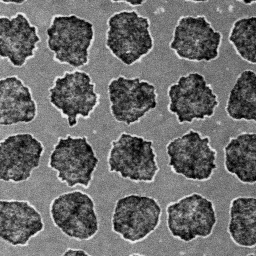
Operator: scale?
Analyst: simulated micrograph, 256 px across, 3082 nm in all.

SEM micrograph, a regular array of holes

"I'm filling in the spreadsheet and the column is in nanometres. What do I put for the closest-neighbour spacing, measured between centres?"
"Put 679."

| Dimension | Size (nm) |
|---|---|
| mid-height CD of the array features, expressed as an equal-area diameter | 564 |